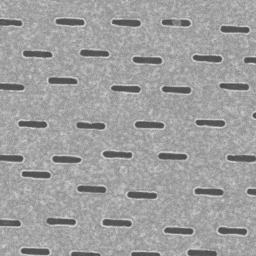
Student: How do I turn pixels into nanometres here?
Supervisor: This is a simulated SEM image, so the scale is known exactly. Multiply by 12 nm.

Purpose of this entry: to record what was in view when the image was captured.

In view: a regular array of holes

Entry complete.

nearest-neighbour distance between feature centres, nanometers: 465